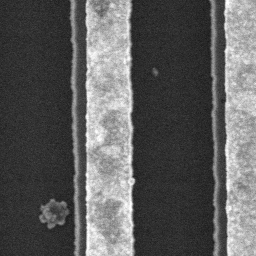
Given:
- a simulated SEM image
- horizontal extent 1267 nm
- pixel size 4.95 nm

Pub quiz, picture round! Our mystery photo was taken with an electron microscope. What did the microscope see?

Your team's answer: lines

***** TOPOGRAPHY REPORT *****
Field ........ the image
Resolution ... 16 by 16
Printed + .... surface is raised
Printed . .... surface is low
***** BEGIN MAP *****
.....+++.....+++
.....+++.....+++
.....+++.....+++
.....+++.....+++
.....+++.....+++
.....+++.....+++
.....+++.....+++
.....+++.....+++
.....+++.....+++
.....+++.....+++
.....+++.....+++
.....+++.....+++
.....+++.....+++
.....+++.....+++
.....+++.....+++
.....+++.....+++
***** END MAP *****